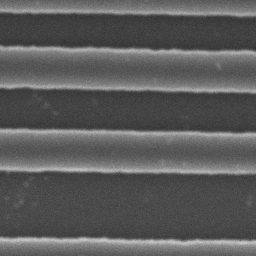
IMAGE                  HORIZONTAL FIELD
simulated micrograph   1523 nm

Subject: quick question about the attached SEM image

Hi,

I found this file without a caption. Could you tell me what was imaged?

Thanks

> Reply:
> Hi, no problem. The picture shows lines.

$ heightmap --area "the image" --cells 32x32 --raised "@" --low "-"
@@@@@@@@@@@@@@@@@@@@@@@@@@@@@@@@
-@@-@@@@@@@@@@@@@@@@@@@@@@@@@@@@
--------------------------------
--------------------------------
--------------------------------
--------------------------------
@@@@@@@@@@@@@@@@@@@@@@@@@@-@@@@@
@@@@@@@@@@@@@@@@@@@@@@@@@@@@@@@@
@@@@@@@@@@@@@@@@@@@@@@@@@@@@@@@@
@@@@@@@@@@@@@@@@@@@@@@@@@@@@@@@@
@@@@@@@@@@@@@@@@@@@@@@@@@@@@@@@@
-------------------------------@
--------------------------------
--------------------------------
--------------------------------
--------------------------------
@@@@@@@@@@@@@@@@@---------------
@@@@@@@@@@@@@@@@@@@@@@@@@@@@@@@@
@@@@@@@@@@@@@@@@@@@@@@@@@@@@@@@@
@@@@@@@@@@@@@@@@@@@@@@@@@@@@@@@@
@@@@@@@@@@@@@@@@@@@@@@@@@@@@@@@@
-------------------@--@@@@@@@@@@
--------------------------------
--------------------------------
--------------------------------
--------------------------------
--------------------------------
--------------------------------
--------------------------------
--------------------------------
@@@@@@@@@@@@@@@@@@@@@@@@@@@@@@@@
@@@@@@@@@@@@@@@@@@@@@@@@@@@@@@@@